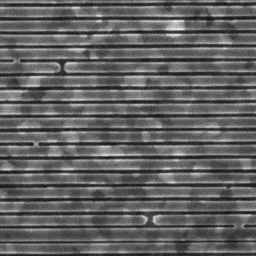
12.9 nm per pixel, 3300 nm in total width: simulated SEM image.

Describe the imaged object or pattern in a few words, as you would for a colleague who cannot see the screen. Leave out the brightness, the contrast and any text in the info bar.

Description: parallel lines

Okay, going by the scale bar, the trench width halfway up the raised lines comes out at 48.3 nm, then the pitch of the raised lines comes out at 179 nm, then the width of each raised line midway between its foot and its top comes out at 130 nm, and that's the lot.